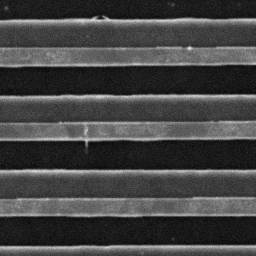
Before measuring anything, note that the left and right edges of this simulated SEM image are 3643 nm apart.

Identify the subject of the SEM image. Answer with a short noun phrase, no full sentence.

lines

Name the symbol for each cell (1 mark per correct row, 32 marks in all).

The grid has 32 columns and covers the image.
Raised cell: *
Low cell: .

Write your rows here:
................................
................................
...........*.*..................
********************************
********************************
********************************
********************************
********************************
................................
................................
................................
................................
********************************
********************************
********************************
********************************
********************************
..........*.....................
................................
................................
................................
********************************
********************************
********************************
********************************
********************************
********************************
................................
................................
................................
................................
********************************